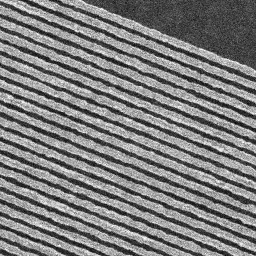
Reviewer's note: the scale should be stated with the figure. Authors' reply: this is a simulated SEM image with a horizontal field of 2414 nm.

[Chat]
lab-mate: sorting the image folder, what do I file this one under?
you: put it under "parallel lines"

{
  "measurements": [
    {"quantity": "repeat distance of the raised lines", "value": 11.5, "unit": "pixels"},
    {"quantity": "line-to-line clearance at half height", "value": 47.1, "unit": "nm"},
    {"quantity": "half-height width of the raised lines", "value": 63.5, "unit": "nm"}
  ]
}